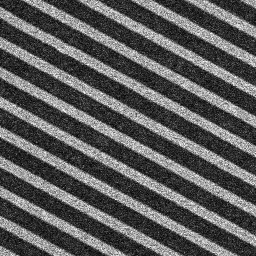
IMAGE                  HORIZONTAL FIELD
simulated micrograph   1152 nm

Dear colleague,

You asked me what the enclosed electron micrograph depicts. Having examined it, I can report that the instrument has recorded parallel lines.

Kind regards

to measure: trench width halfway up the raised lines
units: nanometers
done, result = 77.5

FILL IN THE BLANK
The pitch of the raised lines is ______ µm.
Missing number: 0.118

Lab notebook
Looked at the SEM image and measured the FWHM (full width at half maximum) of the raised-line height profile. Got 42.4 nanometres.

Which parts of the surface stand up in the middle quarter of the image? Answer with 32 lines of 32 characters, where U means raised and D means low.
DDDDDDUUUUUDDDDDDDDDUUUUDDDDDDDD
DDDDDDDDUUUUUDDDDDDDDDUUUUDDDDDD
UDDDDDDDDDUUUUUDDDDDDDDDUUUUDDDD
UUUDDDDDDDDDUUUUDDDDDDDDDDUUUUDD
UUUUUDDDDDDDDUUUUUDDDDDDDDDUUUUU
DDUUUUUDDDDDDDDUUUUUDDDDDDDDDUUU
DDDDUUUUDDDDDDDDDUUUUUDDDDDDDDDU
DDDDDUUUUUDDDDDDDDDUUUUUDDDDDDDD
DDDDDDDUUUUUDDDDDDDDDUUUUUDDDDDD
DDDDDDDDDUUUUUDDDDDDDDDUUUUDDDDD
UUDDDDDDDDDUUUUUDDDDDDDDUUUUUDDD
UUUUDDDDDDDDDUUUUUDDDDDDDDUUUUUD
DUUUUDDDDDDDDDDUUUUDDDDDDDDDUUUU
DDDUUUUDDDDDDDDDUUUUUDDDDDDDDDUU
DDDDDUUUUDDDDDDDDDUUUUUDDDDDDDDD
DDDDDDDUUUUDDDDDDDDDUUUUUDDDDDDD
DDDDDDDDUUUUUDDDDDDDDDUUUUUDDDDD
UDDDDDDDDDUUUUUDDDDDDDDDUUUUUDDD
UUUDDDDDDDDDUUUUDDDDDDDDDDUUUUDD
UUUUUDDDDDDDDDUUUUDDDDDDDDDUUUUU
DDUUUUUDDDDDDDDDUUUUDDDDDDDDDUUU
DDDDUUUUDDDDDDDDDUUUUUDDDDDDDDDU
DDDDDUUUUUDDDDDDDDDUUUUUDDDDDDDD
DDDDDDDUUUUUDDDDDDDDDUUUUUDDDDDD
DDDDDDDDDUUUUUDDDDDDDDDUUUUDDDDD
UUDDDDDDDDDUUUUUDDDDDDDDDUUUUDDD
UUUUDDDDDDDDDUUUUUDDDDDDDDDUUUUD
DUUUUUDDDDDDDDDUUUUDDDDDDDDDDUUU
DDDUUUUDDDDDDDDDDUUUUDDDDDDDDDUU
DDDDDUUUUUDDDDDDDDUUUUUDDDDDDDDD
DDDDDDDUUUUDDDDDDDDDUUUUUDDDDDDD
DDDDDDDDUUUUUDDDDDDDDDUUUUUDDDDD